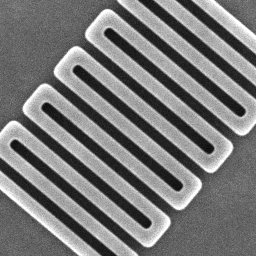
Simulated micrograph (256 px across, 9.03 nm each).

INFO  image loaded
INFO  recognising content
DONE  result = groups of lines, slits or small figures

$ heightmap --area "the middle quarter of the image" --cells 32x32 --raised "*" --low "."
***.*****.....*****....*****....
**....*****....*****....******..
***....*****....*****.....*****.
****....*****....******....*****
*****....*****.....*****....****
.*****....*****.....*****....***
..*****....******....*****....**
...*****.....*****....*****.....
....******....*****....******...
*....******....*****....******..
***....*****....*****.....*****.
****....*****....******....*****
*****....*****.....*****....****
.*****....******....*****....***
..*****....******....*****....**
...*****.....*****....*****.....
....******....*****....*****....
*.....*****....*****.....*****..
**.....*****....*****.....*****.
****....*****....******....*****
*****....******....*****....****
.*****....*****.....*****....***
..*****.....*****....*****.....*
...*****.....*****....*****.....
.....*****....*****....******...
*.....*****....*****.....*****..
***....*****....******....*****.
****....*****.....*****....*****
*****....*****.....*****....****
.*****....******....*****....***
..*****.....*****....*****....**
...*****.....*****....*****..***